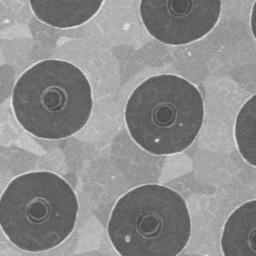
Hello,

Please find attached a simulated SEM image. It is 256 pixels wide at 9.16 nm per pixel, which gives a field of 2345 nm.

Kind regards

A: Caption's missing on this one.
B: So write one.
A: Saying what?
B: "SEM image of ring-shaped grooves with a dot in the middle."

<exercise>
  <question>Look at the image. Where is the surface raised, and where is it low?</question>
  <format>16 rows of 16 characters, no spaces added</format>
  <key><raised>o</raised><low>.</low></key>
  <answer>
oo....ooo.....oo
ooo..oooo....ooo
oooooooooo..oooo
oooooooooooooooo
oo...ooooooooooo
o.....ooo...oooo
o.....oo.....oo.
o....ooo.....oo.
oo..oooo....ooo.
ooooooooo..oooo.
oooooooooooooooo
o...oooooooooooo
.....oo....ooooo
.....oo.....oo..
....ooo.....oo..
o..oooo....ooo..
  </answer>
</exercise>